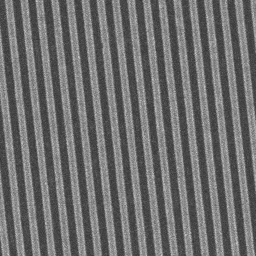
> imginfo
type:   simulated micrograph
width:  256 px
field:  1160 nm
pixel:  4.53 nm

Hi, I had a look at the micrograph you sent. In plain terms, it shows parallel lines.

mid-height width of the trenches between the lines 8.81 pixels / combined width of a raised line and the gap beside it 69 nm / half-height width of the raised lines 6.2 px